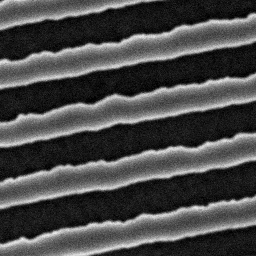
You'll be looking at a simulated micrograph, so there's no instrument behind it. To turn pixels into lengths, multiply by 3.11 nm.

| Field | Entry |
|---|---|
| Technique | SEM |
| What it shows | lines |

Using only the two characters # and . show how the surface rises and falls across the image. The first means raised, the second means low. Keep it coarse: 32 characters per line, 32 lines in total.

#################...............
############....................
#####........................###
#.....................##########
.................###############
.............##################.
.......##################.......
#..#################............
##############..................
##########.....................#
####.....................#######
...................#############
.............###################
.......####################.....
...##################...........
##############..................
##########......................
#####.......................####
.....................##..#######
.................###############
...........###################..
.....####################.......
.#################..............
###############.................
########........................
###.......................######
.....................###########
................################
.........####################...
.....###################........
##################..............
#############...................